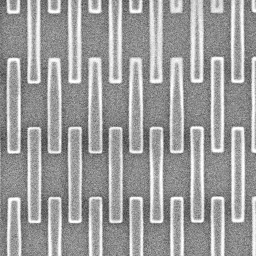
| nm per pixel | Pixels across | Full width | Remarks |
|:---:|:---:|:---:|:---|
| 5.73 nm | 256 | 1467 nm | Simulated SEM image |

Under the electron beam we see groups of lines, slits or small figures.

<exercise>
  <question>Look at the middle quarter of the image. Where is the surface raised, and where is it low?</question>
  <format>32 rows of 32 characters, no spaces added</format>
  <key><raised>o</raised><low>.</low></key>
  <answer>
.ooo...oo...oo...oo...oo...oo...
.ooo..ooo...oo...oo...oo...oo...
.ooo..ooo...oo...oo...oo...oo...
.ooo..ooo...oo...oo...oo...oo...
..oo..ooo...oo...oo........oo...
......ooo........oo........oo...
......ooo........oo........oo...
......ooo........oo........ooo..
......ooo........oo........ooo..
......ooo.......ooo........ooo..
......ooo.......ooo........ooo..
......ooo.......oooo.......ooo..
......ooo.......oooo.......ooo..
......ooo.......oooo.......ooo..
......ooo.......oooo.......ooo..
......ooo.......oooo.......ooo..
.ooo..ooo..ooo..oooo..ooo..ooo..
.ooo..ooo..ooo..oooo..ooo..ooo..
.ooo..ooo..ooo..oooo..ooo..ooo..
.ooo..ooo..ooo..oooo..ooo..ooo..
.ooo..ooo..ooo..oooo..ooo..ooo..
.ooo..ooo..ooo..oooo..ooo..ooo..
.ooo.......ooo........ooo.......
.ooo.......ooo........ooo.......
.ooo.......ooo........oo........
.ooo.......ooo........oo........
.ooo.......ooo........oo........
.ooo.......ooo........oo........
.ooo.......ooo........oo........
.ooo.......ooo........oo........
.ooo.......ooo........oo........
.ooo.......ooo........oo........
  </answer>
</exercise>